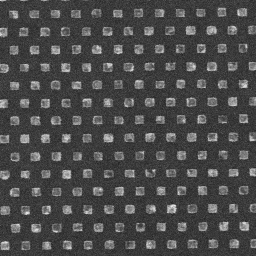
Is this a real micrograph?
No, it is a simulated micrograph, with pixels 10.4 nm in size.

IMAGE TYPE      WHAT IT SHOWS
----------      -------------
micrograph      a regular array of raised bodies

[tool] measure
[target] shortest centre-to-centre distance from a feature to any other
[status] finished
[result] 210 nanometers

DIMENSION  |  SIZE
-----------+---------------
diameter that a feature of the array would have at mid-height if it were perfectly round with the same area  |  92.9 nanometres